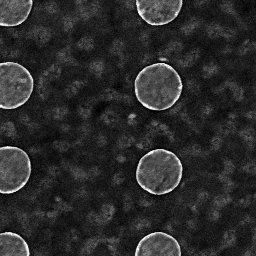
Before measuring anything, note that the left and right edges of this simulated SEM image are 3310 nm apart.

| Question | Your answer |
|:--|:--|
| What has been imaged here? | raised bodies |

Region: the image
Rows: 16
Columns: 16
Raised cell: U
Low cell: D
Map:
UUDDDDDDDUUDDDDD
UDDDDDDDDDDDDDDD
DDDDDDDDDDDDDDDD
DDDDDDDDDDDDDDDD
UUDDDDDDDUUDDDDD
UUDDDDDDUUUDDDDD
UDDDDDDDDUUDDDDD
DDDDDDDDDDDDDDDD
DDDDDDDDDDDDDDDD
UDDDDDDDDUUDDDDD
UUDDDDDDDUUDDDDD
UUDDDDDDDUUDDDDD
DDDDDDDDDDDDDDDD
DDDDDDDDDDDDDDDD
DDDDDDDDDDDDDDDD
UUDDDDDDDUUDDDDD